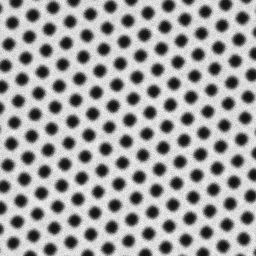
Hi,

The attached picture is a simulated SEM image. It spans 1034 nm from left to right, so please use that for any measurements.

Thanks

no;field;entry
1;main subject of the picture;a regular array of holes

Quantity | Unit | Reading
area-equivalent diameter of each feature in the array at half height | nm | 54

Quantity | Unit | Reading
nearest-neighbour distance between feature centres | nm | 86.5